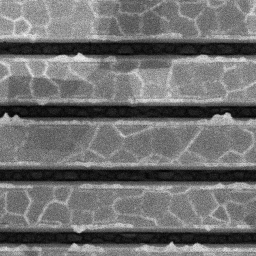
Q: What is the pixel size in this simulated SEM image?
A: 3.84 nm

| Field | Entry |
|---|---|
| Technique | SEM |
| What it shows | one or a few lines or trenches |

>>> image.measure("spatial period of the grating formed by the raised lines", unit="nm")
243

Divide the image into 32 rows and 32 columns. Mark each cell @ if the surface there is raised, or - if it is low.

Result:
@@@@@@@@@@@@@@@@@@@@@@@@@@@@@@@@
@@@@@@@@@@@@@@@@@@@@@@@@@@@@@@@@
@@@@@@@@@@@@@@@@@@@@@@@@@@@@@@@@
@@@@@@@@@@@@@@@@@@@@@@@@@@@@@@@@
@@@@@@@@@@@@@@@@@@@@@@@@@@@@@@@@
--------------------------------
--------------------------------
@@@@@@@@@@@@@@@@@@@@@@@@@@@@@@@@
@@@@@@@@@@@@@@@@@@@@@@@@@@@@@@@@
@@@@@@@@@@@@@@@@@@@@@@@@@@@@@@@@
@@@@@@@@@@@@@@@@@@@@@@@@@@@@@@@@
@@@@@@@@@@@@@@@@@@@@@@@@@@@@@@@@
@@@@@@@@@@@@@@@@@@@@@@@@@@@@@@@@
--------------------------------
@--------------------------@@---
@@@@@@@@@@@@@@@@@@@@@@@@@@@@@@@@
@@@@@@@@@@@@@@@@@@@@@@@@@@@@@@@@
@@@@@@@@@@@@@@@@@@@@@@@@@@@@@@@@
@@@@@@@@@@@@@@@@@@@@@@@@@@@@@@@@
@@@@@@@@@@@@@@@@@@@@@@@@@@@@@@@@
@@@@@@@@@@@@@@@@@@@@@@@@@@@@@@@@
--------------------------------
--------------------------------
@@@@@@@@@@@@@@@@@@@@@@@@@@@@@@@@
@@@@@@@@@@@@@@@@@@@@@@@@@@@@@@@@
@@@@@@@@@@@@@@@@@@@@@@@@@@@@@@@@
@@@@@@@@@@@@@@@@@@@@@@@@@@@@@@@@
@@@@@@@@@@@@@@@@@@@@@@@@@@@@@@@@
@@@@@@@@@@@@@@@@@@@@@@@@@@@@@@@@
--------------------------------
---------------------@----------
@@@@@@@@@@@@@@@@@@@@@@@@@@@@@@@@